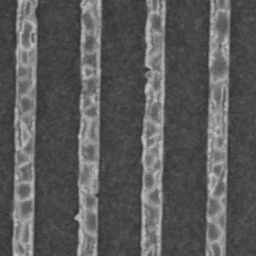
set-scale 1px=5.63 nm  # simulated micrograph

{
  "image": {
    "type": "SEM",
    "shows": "one or a few lines or trenches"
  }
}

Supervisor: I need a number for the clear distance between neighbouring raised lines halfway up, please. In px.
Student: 46.3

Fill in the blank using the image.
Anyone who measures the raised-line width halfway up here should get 106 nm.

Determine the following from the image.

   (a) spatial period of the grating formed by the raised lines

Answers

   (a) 0.362 micrometres